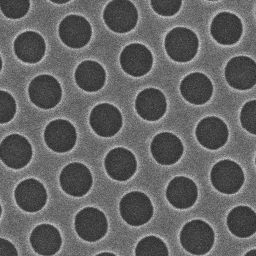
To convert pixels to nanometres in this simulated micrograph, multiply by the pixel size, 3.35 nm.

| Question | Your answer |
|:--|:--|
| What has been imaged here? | a regular array of holes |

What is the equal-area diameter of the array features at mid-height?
116 nm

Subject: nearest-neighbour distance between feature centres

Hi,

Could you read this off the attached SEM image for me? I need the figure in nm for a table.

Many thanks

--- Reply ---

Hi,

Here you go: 156